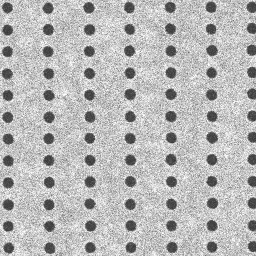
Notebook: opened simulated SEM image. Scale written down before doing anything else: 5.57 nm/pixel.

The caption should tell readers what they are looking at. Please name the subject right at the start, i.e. a regular array of holes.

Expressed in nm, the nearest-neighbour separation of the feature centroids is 120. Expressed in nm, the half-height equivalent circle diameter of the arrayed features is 61.2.